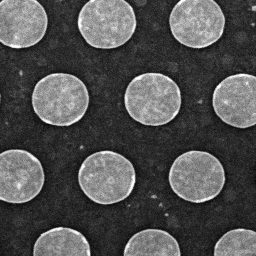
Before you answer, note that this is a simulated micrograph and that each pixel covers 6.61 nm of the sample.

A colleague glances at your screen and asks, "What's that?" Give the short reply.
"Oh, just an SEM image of raised bodies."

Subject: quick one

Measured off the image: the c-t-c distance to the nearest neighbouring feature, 591 nm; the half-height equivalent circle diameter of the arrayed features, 358 nanometres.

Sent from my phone